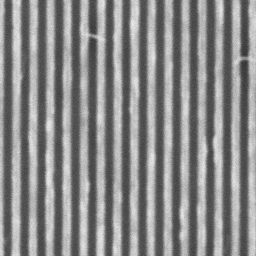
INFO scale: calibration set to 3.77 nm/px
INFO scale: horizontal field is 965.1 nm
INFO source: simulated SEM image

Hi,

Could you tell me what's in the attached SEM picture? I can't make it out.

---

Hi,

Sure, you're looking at parallel lines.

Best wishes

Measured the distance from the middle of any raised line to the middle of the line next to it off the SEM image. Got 16.9 pixels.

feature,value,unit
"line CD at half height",29.7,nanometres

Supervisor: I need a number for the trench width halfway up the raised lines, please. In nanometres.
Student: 33